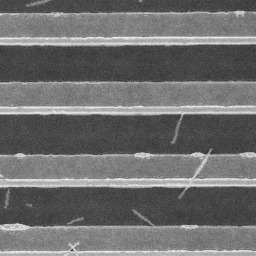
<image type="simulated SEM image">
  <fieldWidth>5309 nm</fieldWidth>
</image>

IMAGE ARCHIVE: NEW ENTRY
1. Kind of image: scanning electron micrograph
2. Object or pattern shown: lines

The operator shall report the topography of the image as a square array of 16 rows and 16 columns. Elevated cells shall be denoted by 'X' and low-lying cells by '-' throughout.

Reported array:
----------------
XXXXXXXXXXXXXXXX
XXXXXXXXXXXXXXXX
----------------
----------------
XXXXXXXXXXXXXXXX
XXXXXXXXXXXXXXXX
----------------
----------------
----------------
XXXXXXXXXXXXXXXX
XXXXXXXXXXXXXXXX
----------------
----------------
XXXXXXXXXXXXXXXX
XXXXXXXXXXXXXXXX